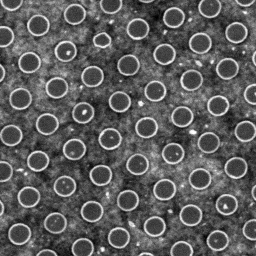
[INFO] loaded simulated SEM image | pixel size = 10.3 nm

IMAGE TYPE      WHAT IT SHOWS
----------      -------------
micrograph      a regular array of raised bodies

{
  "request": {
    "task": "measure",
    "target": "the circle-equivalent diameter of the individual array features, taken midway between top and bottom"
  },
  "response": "215 nm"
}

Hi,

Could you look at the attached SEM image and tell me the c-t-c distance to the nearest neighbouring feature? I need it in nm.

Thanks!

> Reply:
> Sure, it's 380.